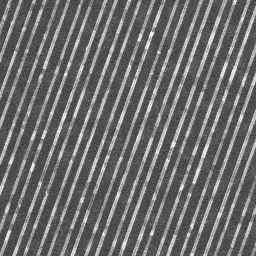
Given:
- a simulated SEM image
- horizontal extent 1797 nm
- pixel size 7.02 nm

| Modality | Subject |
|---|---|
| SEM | parallel lines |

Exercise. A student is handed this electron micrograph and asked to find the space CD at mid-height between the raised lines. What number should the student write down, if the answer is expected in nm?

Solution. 52.9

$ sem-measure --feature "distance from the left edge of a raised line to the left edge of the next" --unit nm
78.7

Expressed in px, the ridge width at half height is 2.46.